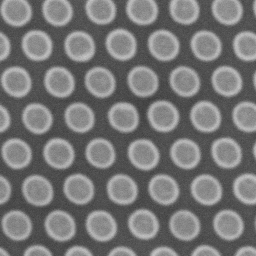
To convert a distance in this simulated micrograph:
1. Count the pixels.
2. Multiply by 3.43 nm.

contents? a regular array of raised bodies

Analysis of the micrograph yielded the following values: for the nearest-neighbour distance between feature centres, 0.14 um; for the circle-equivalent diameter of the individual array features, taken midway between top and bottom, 27.5 pixels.